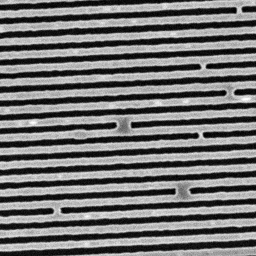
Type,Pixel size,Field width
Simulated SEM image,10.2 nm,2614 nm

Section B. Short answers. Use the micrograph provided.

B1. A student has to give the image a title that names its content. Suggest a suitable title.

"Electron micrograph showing parallel lines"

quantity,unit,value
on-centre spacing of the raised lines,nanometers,140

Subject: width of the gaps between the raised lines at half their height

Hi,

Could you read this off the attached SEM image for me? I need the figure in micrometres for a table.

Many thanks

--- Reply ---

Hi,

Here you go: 0.0676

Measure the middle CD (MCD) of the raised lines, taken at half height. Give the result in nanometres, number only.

68.9